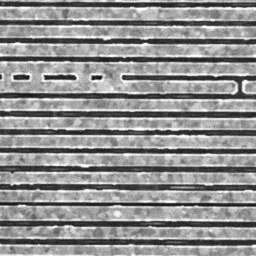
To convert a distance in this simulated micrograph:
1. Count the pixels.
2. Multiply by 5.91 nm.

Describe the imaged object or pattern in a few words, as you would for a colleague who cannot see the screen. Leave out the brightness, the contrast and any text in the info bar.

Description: parallel lines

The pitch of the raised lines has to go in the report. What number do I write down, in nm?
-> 108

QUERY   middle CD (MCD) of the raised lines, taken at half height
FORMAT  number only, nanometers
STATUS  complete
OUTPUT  71.7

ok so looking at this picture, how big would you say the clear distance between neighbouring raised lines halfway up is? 38.4 nm